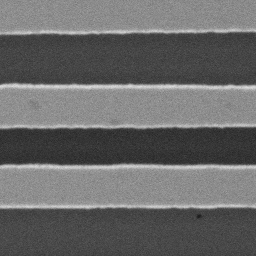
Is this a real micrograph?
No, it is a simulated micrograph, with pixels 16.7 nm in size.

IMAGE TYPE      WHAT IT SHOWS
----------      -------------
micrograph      lines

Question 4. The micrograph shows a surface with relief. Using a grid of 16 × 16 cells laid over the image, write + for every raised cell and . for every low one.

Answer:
++++++++++++++++
++++++++++++++++
................
................
................
++++++++++++++++
++++++++++++++++
++++++++++++++++
................
................
++++++++++++++++
++++++++++++++++
++++++++++++++++
................
................
................